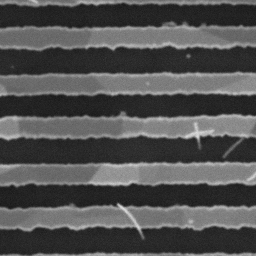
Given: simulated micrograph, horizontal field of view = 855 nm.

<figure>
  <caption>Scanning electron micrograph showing lines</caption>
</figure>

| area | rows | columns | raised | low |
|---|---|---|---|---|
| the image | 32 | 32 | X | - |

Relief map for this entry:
X-XXXXXXXX-XX----X----XXXXX--X-X
--------------------------------
--------------------------------
-XXXXXXXX-XXXXXXXXXXXXXXXXXXXXXX
XXXXXXXXXXXXXXXXXXXXXXXXXXXXXXXX
XXXXXXXXXXXXXXXXXXXXXXXXXXXXXXXX
--------------------------------
--------------------------------
--------------------------------
-XXXXXXXXXXXXXXXXXXXXXXXXXXXXXXX
XXXXXXXXXXXXXXXXXXXXXXXXXXXXXXXX
XXXXXXXXXXXXXXXXXXXXXXXXXXXXXXXX
--------------------------------
--------------------------------
-------------------------X-XXXXX
XXXXXXXXXXXXXXXXXXXXXXXXXXXXXXXX
XXXXXXXXXXXXXXXXXXXXXXXXXXXXXXXX
--------------------------------
--------------------------------
--------------------------------
-----X-----XXX-XXXXXXXXXXXXXXXXX
XXXXXXXXXXXXXXXXXXXXXXXXXXXXXXXX
XXXXXXXXXXXXXXXXXXXXXXXXXXXXXXXX
--------------------------------
--------------------------------
--------------------------------
XXXXXXXXXXXXXXXXXXXXXXXXXXXXXXXX
XXXXXXXXXXXXXXXXXXXXXXXXXXXXXXXX
XXXX--X--XX------X------XX---X--
--------------------------------
--------------------------------
--------------------------------